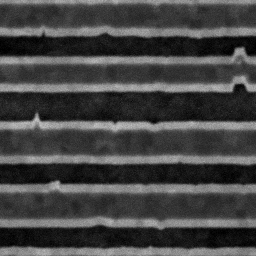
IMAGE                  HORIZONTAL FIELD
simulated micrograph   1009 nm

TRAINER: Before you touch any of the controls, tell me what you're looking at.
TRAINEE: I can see one or a few lines or trenches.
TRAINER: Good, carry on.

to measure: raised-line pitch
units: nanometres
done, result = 260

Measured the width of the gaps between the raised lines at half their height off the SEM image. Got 107 nm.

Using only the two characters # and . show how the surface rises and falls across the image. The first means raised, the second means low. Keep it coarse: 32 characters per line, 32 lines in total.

################################
################################
################################
################################
................................
................................
................................
#..###..#....##..###.....#######
################################
################################
#############################..#
................................
................................
................................
................................
....#...........................
################################
################################
################################
################################
................................
................................
................................
......####................#.....
################################
################################
################################
################################
................................
................................
................................
#####...####..#########..#.#####